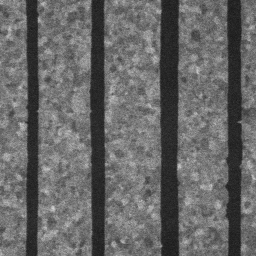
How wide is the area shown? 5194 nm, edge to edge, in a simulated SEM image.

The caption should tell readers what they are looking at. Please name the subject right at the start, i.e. one or a few lines or trenches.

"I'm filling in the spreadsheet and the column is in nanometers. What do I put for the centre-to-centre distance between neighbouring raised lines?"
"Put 1400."